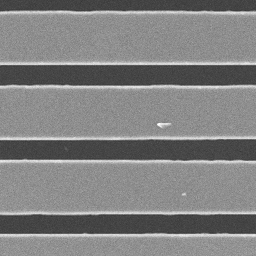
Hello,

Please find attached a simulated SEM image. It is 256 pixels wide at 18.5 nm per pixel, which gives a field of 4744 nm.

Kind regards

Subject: lines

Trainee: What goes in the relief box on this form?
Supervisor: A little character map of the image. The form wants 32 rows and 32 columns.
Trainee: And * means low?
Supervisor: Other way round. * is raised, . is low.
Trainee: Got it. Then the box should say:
................................
.********..*************.*..*...
********************************
********************************
********************************
********************************
********************************
********************************
................................
................................
................................
********************************
********************************
********************************
********************************
********************************
********************************
................................
................................
................................
********************************
********************************
********************************
********************************
********************************
********************************
********************************
................................
................................
********************************
********************************
********************************